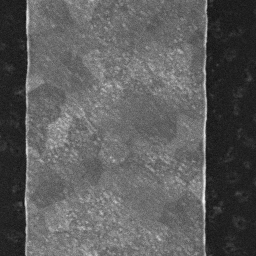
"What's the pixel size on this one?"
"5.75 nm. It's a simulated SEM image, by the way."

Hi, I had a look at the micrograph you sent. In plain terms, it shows one or a few lines or trenches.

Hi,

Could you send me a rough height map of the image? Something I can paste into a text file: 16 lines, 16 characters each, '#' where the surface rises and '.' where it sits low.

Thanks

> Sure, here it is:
..###########...
..###########...
..###########...
..###########...
..###########...
..###########...
..###########...
..###########...
..###########...
..###########...
..###########...
..###########...
..###########...
..###########...
..###########...
..###########...